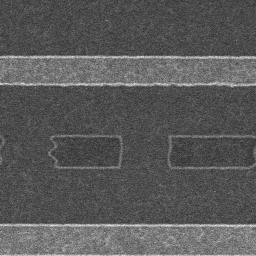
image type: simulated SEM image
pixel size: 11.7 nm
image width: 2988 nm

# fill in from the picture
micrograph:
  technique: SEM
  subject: one or a few lines or trenches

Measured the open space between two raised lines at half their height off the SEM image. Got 0.647 um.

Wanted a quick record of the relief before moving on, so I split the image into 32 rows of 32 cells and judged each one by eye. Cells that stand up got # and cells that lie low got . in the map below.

................................
................................
................................
................................
................................
................................
................................
################################
################################
################################
...##.#.....#########.####..####
................................
................................
................................
................................
................................
................................
.......########......###########
.......########......###########
......#########......###########
.......########......###########
................................
................................
................................
................................
................................
................................
................................
################################
################################
################################
################################